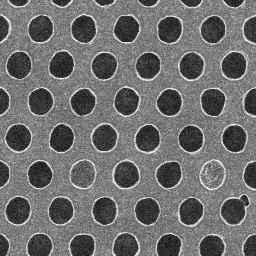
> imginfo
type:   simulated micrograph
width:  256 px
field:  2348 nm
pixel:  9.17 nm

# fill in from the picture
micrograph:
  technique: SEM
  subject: a regular array of holes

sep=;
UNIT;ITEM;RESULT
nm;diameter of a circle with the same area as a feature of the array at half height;240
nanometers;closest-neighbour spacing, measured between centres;384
